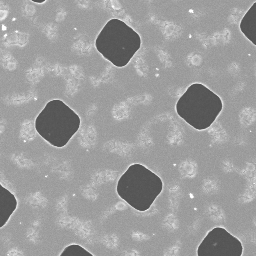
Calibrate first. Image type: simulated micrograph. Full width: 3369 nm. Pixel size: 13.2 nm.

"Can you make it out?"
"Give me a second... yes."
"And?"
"holes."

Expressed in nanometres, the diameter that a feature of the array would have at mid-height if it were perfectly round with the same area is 565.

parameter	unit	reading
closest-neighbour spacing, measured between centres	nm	1320